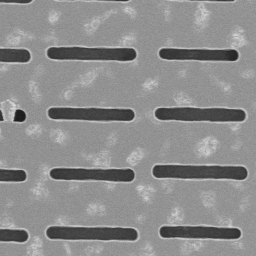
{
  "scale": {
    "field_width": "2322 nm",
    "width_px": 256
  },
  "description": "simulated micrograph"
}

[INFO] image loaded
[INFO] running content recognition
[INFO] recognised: a regular array of holes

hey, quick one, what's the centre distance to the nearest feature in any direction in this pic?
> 538 nm